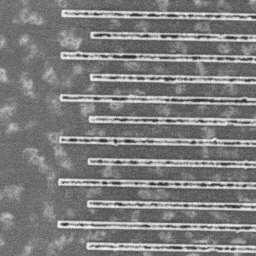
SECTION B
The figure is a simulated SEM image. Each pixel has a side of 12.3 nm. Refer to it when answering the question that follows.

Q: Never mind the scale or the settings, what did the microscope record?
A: parallel lines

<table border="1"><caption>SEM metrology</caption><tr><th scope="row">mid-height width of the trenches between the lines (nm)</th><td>192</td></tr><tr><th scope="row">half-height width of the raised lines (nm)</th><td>67.5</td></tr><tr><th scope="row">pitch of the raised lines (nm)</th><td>259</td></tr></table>